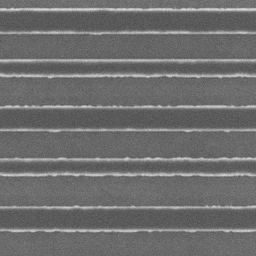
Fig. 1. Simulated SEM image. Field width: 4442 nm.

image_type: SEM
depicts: lines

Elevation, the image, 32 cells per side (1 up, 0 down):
00000000000000000000000000000000
11111111111111111111111111111111
11111111111111111111111111111111
11111111111111111111111111111111
00000000000000000000000000000000
00000000000000000000000000000000
00000000000000000000000000000000
00000000000000000000000000000000
11111111111111111111111111111111
11111111111111111111011111111111
00000000000000000000000000000000
00000000000000000000000000000000
00000000000000000000000000000000
11111111111111111111111111111111
11111111111111111111111111111111
11111111111111111111111111111111
00000000000000000000000000000000
00000000000000000000000000000000
00000000000000000000000000000000
00000000000000000000000000000000
11111111111111111111111111111111
11111111111111111111111111111111
00000000000000000000000000000000
00000000000000000000000000000000
00000000000000000000000000000000
00000000000000000000000000000000
11111111111111111111111111111111
11111111111111111111111111111111
11111111111111111111111111111111
00000000000000000000000000000000
00000000000000000000000000000000
00000000000000000000000000000000